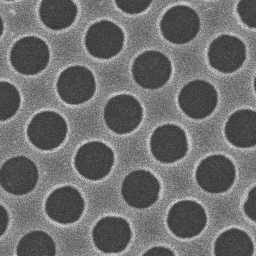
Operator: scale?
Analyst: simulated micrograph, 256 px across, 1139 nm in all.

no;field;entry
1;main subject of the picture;a regular array of holes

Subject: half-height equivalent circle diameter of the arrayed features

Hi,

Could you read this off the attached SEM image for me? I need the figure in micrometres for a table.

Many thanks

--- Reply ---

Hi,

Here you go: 0.172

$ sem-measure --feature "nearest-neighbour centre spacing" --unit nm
238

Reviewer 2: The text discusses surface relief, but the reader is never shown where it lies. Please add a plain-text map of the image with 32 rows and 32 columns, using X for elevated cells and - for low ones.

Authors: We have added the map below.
XXXXX----XXXXXX----XXXXXXXXXXX--
XXXXX-----XXXXXX--XXX---XXXXXX--
XXXXX----XXXXXXXXXXX-----XXXXX--
XXXXXX--XXX----XXXXX-----XXXXXXX
XXXXXXXXXXX----XXXXX----XXXX-XXX
XX----XXXXX----XXXXXXXXXXX----XX
X-----XXXXX----XXX--XXXXXX-----X
X-----XXXXXXXXXXX----XXXXX-----X
XX----XXX--XXXXXX----XXXXXX---XX
XXXXXXX-----XXXXX----XXXXXXXXXXX
-XXXXXX-----XXXXX----XX---XXXXXX
--XXXXX-----XXXXXXXXXXX----XXXXX
---XXXXX---XXX---XXXXX-----XXXXX
--XXXXXXXXXXX-----XXXXX----XXXXX
--XX----XXXXX-----XXXXXX--XXX---
XXXX----XXXXX----XXXXXXXXXXX----
XXX-----XXXXXX--XXX----XXXXX----
XXXX----XXXXXXXXXXX----XXXXXX---
XXXXX--XXX----XXXXX----XXXXXXXXX
XXXXXXXXX-----XXXXX----XXX--XXXX
----XXXXX-----XXXXXXXXXXX----XXX
-----XXXXX----XXX--XXXXXX----XXX
-----XXXXXXXXXXX----XXXXX----XXX
----XXXX-XXXXXX-----XXXXX----XXX
XXXXXX----XXXXX-----XXXXXXXXXXX-
XXXXXX----XXXXXX---XXX---XXXXXX-
-XXXXX----XXXXXXXXXXX-----XXXXX-
-XXXXXX---XXX---XXXXX-----XXXXXX
-XXXXXXXXXXX----XXXXX-----XXXXXX
XXX---XXXXXX----XXXXXX--XXX----X
XX-----XXXXX----XXXXXXXXXXX-----
XX-----XXXXXX--XXX---XXXXXX-----